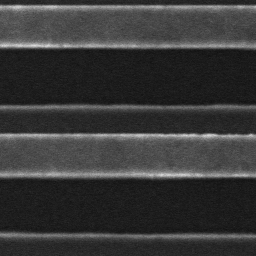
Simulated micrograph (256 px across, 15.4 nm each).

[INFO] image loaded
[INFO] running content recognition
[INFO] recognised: lines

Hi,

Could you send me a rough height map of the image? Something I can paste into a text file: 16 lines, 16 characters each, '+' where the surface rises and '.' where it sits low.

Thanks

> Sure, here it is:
++++++++++++++++
++++++++++++++++
++++++++++++++++
................
................
................
................
++++++++++++++++
++++++++++++++++
++++++++++++++++
++++++++++++++++
................
................
................
................
++++++++++++++++